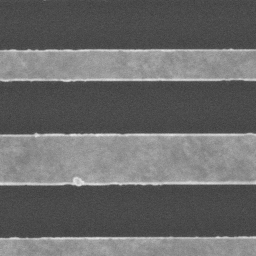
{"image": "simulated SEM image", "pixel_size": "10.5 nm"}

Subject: lines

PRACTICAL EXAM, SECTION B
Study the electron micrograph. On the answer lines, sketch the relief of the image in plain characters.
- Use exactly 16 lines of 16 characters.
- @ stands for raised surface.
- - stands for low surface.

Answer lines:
----------------
----------------
----------------
@@@@@@@@@@@@@@@@
@@@@@@@@@@@@@@@@
----------------
----------------
----------------
@@@@@@@@@@@@@@@@
@@@@@@@@@@@@@@@@
@@@@@@@@@@@@@@@@
@@@@@@@---------
----------------
----------------
----------------
@@@@@@@@@@@@@@@@